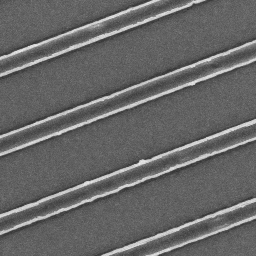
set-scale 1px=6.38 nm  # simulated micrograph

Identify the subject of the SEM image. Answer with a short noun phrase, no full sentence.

one or a few lines or trenches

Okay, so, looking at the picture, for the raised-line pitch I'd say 0.471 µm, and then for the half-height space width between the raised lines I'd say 56.6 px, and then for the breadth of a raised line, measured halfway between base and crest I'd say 114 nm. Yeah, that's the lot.